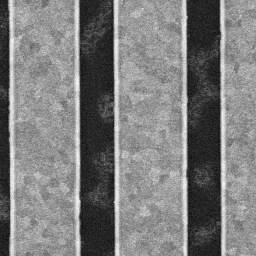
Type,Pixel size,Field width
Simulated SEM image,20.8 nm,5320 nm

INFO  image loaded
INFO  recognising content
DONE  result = one or a few lines or trenches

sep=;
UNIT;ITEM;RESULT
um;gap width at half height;0.808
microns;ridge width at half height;1.38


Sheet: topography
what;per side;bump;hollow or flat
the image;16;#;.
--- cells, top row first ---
.####..#####..##
.####..#####..##
.####..#####..##
.####..#####..##
.####..#####..##
.####..#####..##
.####..#####..##
.####..#####..##
.####..#####..##
.####..#####..##
.####..#####..##
.####..#####..##
.####..#####..##
.####..#####..##
.####..#####..##
.####..#####..##